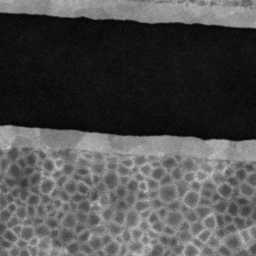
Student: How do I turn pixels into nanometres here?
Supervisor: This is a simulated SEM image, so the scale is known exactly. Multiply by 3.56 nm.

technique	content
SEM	one or a few lines or trenches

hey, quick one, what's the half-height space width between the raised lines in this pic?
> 471 nanometres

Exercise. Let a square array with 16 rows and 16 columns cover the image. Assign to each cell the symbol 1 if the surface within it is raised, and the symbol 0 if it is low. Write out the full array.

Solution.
0000001111111111
0000000000000000
0000000000000000
0000000000000000
0000000000000000
0000000000000000
0000000000000000
0000000000000000
0000000000000000
1111111111111111
1111111111111111
1111111111111111
1111111111111111
1111111111111111
1111111111111111
1111111111111111